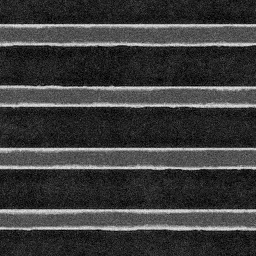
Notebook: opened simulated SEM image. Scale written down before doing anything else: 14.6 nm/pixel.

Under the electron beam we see lines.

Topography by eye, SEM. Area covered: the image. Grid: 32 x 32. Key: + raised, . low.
................................
................................
................................
++++++++++++++++++++++++++++++++
++++++++++++++++++++++++++++++++
++++++++++++++++++++++++++++++++
................................
................................
................................
................................
................................
++++++++++++++++++++++++++++++++
++++++++++++++++++++++++++++++++
................................
................................
................................
................................
................................
................................
++++++++++++++++++++++++++++++++
++++++++++++++++++++++++++++++++
................................
................................
................................
................................
................................
++++++++++++++++++++++++++++++++
++++++++++++++++++++++++++++++++
++++++++++++++++++++++++++++++++
................................
................................
................................